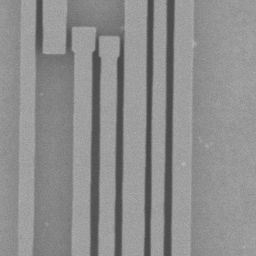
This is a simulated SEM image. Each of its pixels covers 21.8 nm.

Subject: groups of lines, slits or small figures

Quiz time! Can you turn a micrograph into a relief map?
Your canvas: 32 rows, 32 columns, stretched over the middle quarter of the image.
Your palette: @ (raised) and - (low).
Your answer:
---@@@@--@@@@--@@@@@--@@@---@@@@
---@@@@--@@@@--@@@@@--@@@---@@@@
---@@@@--@@@@--@@@@@--@@@---@@@@
---@@@@--@@@@--@@@@@--@@@---@@@@
---@@@@--@@@@--@@@@@--@@@---@@@@
---@@@@--@@@@--@@@@@--@@@---@@@@
---@@@@--@@@@--@@@@@--@@@--@@@@@
---@@@@--@@@@--@@@@@--@@@--@@@@@
---@@@@--@@@@--@@@@@--@@@--@@@@@
---@@@@--@@@@--@@@@@--@@@--@@@@@
---@@@@--@@@@--@@@@@--@@@--@@@@@
---@@@@--@@@@--@@@@@--@@@--@@@@@
---@@@@--@@@@--@@@@@--@@@--@@@@@
---@@@@--@@@@--@@@@@--@@@--@@@@@
---@@@@--@@@@--@@@@@--@@@--@@@@@
---@@@@--@@@@--@@@@@--@@@--@@@@@
---@@@@--@@@@--@@@@@--@@@--@@@@@
---@@@@--@@@@--@@@@@--@@@--@@@@@
---@@@@--@@@@--@@@@@--@@@--@@@@@
---@@@@--@@@@--@@@@@--@@@--@@@@@
---@@@@--@@@@--@@@@@--@@@--@@@@@
---@@@@--@@@@--@@@@@--@@@--@@@@@
---@@@@--@@@@--@@@@@--@@@--@@@@@
---@@@@--@@@@--@@@@@--@@@--@@@@@
---@@@@--@@@@--@@@@@--@@@--@@@@@
---@@@@--@@@@--@@@@@--@@@--@@@@@
---@@@@--@@@@--@@@@@--@@@--@@@@@
--@@@@@--@@@@--@@@@@--@@@--@@@@@
--@@@@@--@@@@--@@@@@--@@@--@@@@@
---@@@@--@@@@--@@@@@--@@@--@@@@@
---@@@@--@@@@--@@@@@--@@@--@@@@@
---@@@@--@@@@--@@@@@--@@@--@@@@@